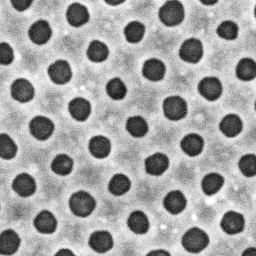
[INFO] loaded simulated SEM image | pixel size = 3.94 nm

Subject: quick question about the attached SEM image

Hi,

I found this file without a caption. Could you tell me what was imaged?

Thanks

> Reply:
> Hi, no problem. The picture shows a regular array of holes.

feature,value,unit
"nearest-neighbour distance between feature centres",0.164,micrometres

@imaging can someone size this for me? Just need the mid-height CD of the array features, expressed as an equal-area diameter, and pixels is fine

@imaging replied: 24.8